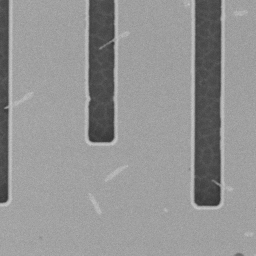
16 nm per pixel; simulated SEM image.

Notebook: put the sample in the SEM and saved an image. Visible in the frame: one or a few lines or trenches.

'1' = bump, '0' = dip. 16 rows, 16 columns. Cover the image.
0111100111110011
0111100111110011
0111100111110011
0111100111110011
0111100111110011
0111100111110011
0111100111110011
0111100111110011
0111100111110011
0111111111110011
0111111111110011
0111111111110011
1111111111110011
1111111111111111
1111111111111111
1111111111111111